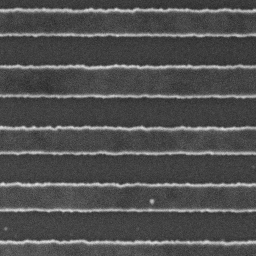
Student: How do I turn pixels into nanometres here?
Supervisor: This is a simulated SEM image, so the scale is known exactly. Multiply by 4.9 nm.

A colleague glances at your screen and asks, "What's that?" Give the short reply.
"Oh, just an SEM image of lines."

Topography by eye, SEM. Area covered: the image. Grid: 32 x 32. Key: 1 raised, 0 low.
00000000000000000000000000000000
11111111111111111111111111111111
11111111111111111111111111111111
11111111111111111111111111111111
00000000001100100000001001000110
00000000000000000000000000000000
00000000000000000000000000000000
00000000000000000000000000000000
11111111111111111111111111111111
11111111111111111111111111111111
11111111111111111111111111111111
11111111111111111111111111111111
00000000000000000000000000000000
00000000000000000000000000000000
00000000000000000000000000000000
00000000000000000000000000000000
11111111111111111111111111111111
11111111111111111111111111111111
11111111111111111111111111111111
00000000000000000000000000000000
00000000000000000000000000000000
00000000000000000000000000000000
00000000000000000000000000000000
11111111111111111111111111111111
11111111111111111111111111111111
11111111111111111111111111111111
00000000000000000000000000000000
00000000000000000000000000000000
00000000000000000000000000000000
00000000000000000000000000000000
11111111111111111111111111111111
11111111111111111111111111111111